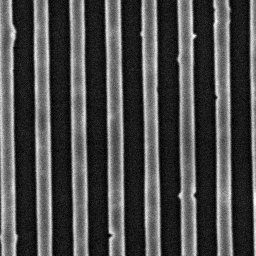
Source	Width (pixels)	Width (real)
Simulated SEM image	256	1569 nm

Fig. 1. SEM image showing parallel lines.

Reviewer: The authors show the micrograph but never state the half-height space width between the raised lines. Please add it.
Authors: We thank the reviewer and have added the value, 139 nanometres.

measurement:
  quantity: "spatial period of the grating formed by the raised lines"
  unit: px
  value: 36.1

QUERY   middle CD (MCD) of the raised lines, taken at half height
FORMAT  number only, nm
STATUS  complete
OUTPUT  85.8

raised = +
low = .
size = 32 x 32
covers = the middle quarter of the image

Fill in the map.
..+++......+++......+++......+++
..+++......+++......+++......+++
..+++......+++......+++......+++
..+++......+++......+++......+++
..+++......+++......+++......+++
..+++......+++......+++......+++
..+++......+++......+++......+++
..+++......+++......+++......+++
..+++......+++......+++......+++
..+++......+++......+++......+++
..+++......+++......+++......+++
..+++......+++......+++......+++
..+++......+++......+++......+++
..+++......+++......+++......+++
..+++......+++......+++......+++
..+++......+++......+++......+++
..+++......+++......+++......+++
..+++......++++.....+++......+++
..+++......++++.....+++......+++
..+++......++++.....+++......+++
..+++......++++.....+++......+++
..+++......++++.....+++......+++
..+++......++++......++......+++
..+++......++++......++......+++
..+++......++++......++......+++
..+++......++++......++......+++
..+++......++++......++......+++
..++++.....++++......++......+++
..++++.....++++.....++++.....+++
..++++.....++++.....++++.....+++
..++++.....++++.....++++.....+++
..++++.....++++.....++++.....+++